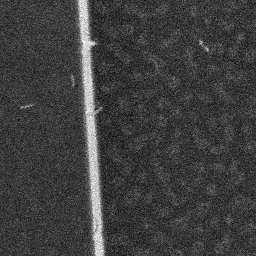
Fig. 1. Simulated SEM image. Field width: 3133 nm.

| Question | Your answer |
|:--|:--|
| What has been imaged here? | one or a few lines or trenches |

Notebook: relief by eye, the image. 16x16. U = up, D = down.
UUUUUDDDDDDDDDDD
UUUUUDDDDDDDDDDD
UUUUUDDDDDDDDDDD
UUUUUDDDDDDDDDDD
UUUUUUDDDDDDDDDD
UUUUUUDDDDDDDDDD
UUUUUUDDDDDDDDDD
UUUUUUDDDDDDDDDD
UUUUUUDDDDDDDDDD
UUUUUUDDDDDDDDDD
UUUUUUDDDDDDDDDD
UUUUUUDDDDDDDDDD
UUUUUUDDDDDDDDDD
UUUUUUDDDDDDDDDD
UUUUUUDDDDDDDDDD
UUUUUUDDDDDDDDDD